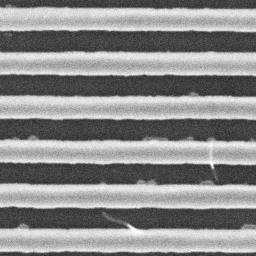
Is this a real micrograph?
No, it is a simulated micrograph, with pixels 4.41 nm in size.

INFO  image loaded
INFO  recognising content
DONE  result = lines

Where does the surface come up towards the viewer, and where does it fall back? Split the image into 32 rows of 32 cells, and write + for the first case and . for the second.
................................
++++++++++++++++++++++++++++++++
++++++++++++++++++++++++++++++++
++++++++++++++++++++++++++++++++
................................
................................
................................
++++++++++++++++++++++++++++++++
++++++++++++++++++++++++++++++++
................................
................................
................................
++++++++++++++++++++++++++++++++
++++++++++++++++++++++++++++++++
++++++++++++++++++++++++++++++++
................................
................................
................................
++++++++++++++++++++++++++++++++
++++++++++++++++++++++++++++++++
..........................+.++++
................................
................................
++++++++++++++++++++++++++++++++
++++++++++++++++++++++++++++++++
++++++++++++++++++++++++++++++++
................................
................................
................................
++++++++++++++++++++++++++++++++
++++++++++++++++++++++++++++++++
................................